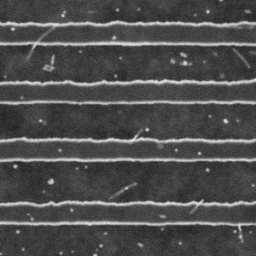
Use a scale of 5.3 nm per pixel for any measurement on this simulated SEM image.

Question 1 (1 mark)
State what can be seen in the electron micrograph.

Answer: lines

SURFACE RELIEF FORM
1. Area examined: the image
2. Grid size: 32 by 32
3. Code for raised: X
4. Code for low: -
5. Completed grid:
--------------------------------
--------------------------------
--------------------------------
XXXXXXXXXXXXXXXXXXXXXXXXXXXXXXXX
XXXXXXXXXXXXXXXXXXXXXXXXXXXXXXXX
XXX-XXXXXXX----XXXXX-XXXXXXXXXXX
--------------------------------
--------------------------------
--------------------------------
--------------------------------
XXXXXXXXXX--XXXXXXXXXXXXXXXXXXXX
XXXXXXXXXXXXXXXXXXXXXXXXXXXXXXXX
XXXXXXXXXXXXXXXXXXXXXXXXXXXXXXXX
--------------------------------
--------------------------------
--------------------------------
--------------------------------
-XXX-XXXXXXX-XX-XXX----XXX------
XXXXXXXXXXXXXXXXXXXXXXXXXXXXXXXX
XXXXXXXXXXXXXXXXXXXXXXXXXXXXXXXX
--------------------------------
--------------------------------
--------------------------------
--------------------------------
--------------------------------
--XX--XXXXXXXXX-XXXXXX-XXXXX-XXX
XXXXXXXXXXXXXXXXXXXXXXXXXXXXXXXX
XXXXXXXXXXXXXXXXXXXXXXXXXXXXXXXX
--------------------------------
--------------------------------
--------------------------------
--------------------------------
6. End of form